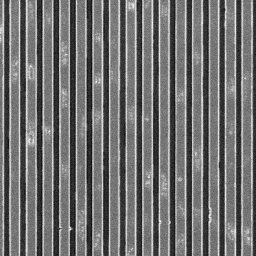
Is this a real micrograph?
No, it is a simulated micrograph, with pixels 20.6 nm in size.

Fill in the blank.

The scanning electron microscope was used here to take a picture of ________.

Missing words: parallel lines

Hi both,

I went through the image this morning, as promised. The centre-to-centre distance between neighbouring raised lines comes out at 0.342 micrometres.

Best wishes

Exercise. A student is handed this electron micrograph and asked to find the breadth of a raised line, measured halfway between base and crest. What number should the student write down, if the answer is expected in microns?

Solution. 0.209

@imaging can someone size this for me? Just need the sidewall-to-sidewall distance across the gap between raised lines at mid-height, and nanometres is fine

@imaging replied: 134